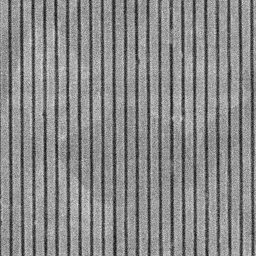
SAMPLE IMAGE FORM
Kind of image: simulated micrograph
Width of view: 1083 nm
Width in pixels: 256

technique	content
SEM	parallel lines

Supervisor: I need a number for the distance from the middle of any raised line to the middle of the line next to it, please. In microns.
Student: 0.0487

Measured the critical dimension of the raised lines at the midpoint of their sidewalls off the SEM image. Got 30.6 nanometers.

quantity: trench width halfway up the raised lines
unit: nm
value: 18.5